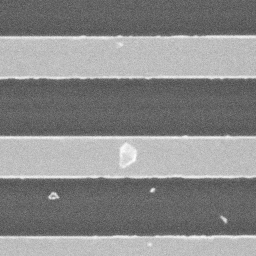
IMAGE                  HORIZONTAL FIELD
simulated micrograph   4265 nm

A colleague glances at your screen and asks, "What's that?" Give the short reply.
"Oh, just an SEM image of lines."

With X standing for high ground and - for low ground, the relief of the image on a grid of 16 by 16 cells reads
----------------
----------------
XXXXXXXXXXXXXXXX
XXXXXXXXXXXXXXXX
XXXXXXXXXXXXXXXX
----------------
----------------
----------------
----------------
XXXXXXXXXXXXXXXX
XXXXXXXXXXXXXXXX
----------------
----------------
----------------
----------------
XXXXXXXXXXXXXXXX